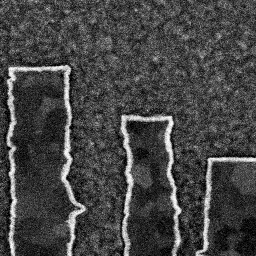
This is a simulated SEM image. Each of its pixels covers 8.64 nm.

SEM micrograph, one or a few lines or trenches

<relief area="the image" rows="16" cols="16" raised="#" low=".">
................
................
................
................
.###............
.###............
.###............
.###....##......
.###....###.....
.###....###.....
.###....###..###
.###....###..###
.####...###..###
.####...###..###
.####...###..###
.###....###..###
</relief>